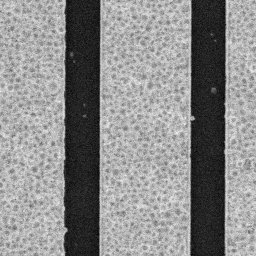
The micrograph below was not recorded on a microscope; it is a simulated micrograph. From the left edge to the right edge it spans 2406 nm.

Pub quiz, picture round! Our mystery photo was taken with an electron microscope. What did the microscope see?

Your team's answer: one or a few lines or trenches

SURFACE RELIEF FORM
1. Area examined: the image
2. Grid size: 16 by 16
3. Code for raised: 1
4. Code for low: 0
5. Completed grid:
1111001111110011
1111001111110011
1111001111110011
1111001111110011
1111001111110011
1111001111110011
1111001111110011
1111001111110011
1111001111110011
1111001111110011
1111001111110011
1111001111110011
1111001111110011
1111001111110011
1111001111110011
1111001111110011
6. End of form